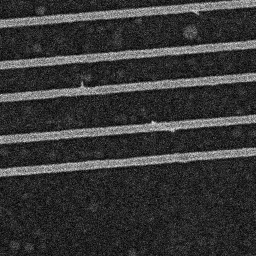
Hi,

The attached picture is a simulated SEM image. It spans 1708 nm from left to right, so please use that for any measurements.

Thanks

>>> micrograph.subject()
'parallel lines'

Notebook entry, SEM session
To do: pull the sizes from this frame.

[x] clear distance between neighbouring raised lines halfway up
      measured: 173 nm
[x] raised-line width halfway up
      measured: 47.4 nm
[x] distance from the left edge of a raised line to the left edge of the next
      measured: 0.247 um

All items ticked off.